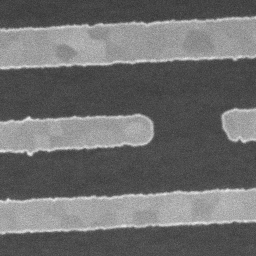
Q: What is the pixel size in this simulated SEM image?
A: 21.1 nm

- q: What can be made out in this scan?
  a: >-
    one or a few lines or trenches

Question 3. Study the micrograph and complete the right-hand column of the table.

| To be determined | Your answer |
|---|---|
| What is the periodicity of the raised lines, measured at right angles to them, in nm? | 1770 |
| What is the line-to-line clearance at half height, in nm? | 1080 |